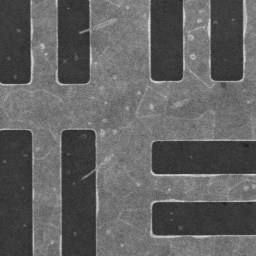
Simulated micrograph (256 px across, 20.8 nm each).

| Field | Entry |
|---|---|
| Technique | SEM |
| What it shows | groups of lines, slits or small figures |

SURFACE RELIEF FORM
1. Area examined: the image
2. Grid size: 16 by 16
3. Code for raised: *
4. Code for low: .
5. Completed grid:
..**..***..**..*
..**..***..**..*
..**..***..**..*
..**..***...*..*
..**..***..**..*
****************
****************
****************
..**..**********
..**..***.......
..**..****......
..**..**********
..**..**********
..**..***.......
..**..****......
..**..**********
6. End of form